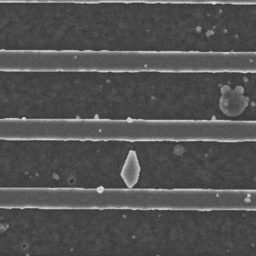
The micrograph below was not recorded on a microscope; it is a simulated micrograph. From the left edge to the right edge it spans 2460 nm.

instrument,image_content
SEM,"lines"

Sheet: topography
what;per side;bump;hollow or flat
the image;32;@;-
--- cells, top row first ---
--------------------------------
--------------------------------
--------------------------------
--------------------------------
--------------------------------
--------------------------------
@@@@@@@@@@@@@@@@@@@@@@@@@-------
@@@@@@@@@@@@@@@@@@@@@@@@@@@@@@@@
@@@@@@@@@@@@@@@@@@@@@@@@@@@@@@@@
--------------------------------
--------------------------------
--------------------------------
--------------------------------
--------------------------------
--------------------------------
@@@@@@@@@@@@@@@@@@@@@@@@@@@@@@@@
@@@@@@@@@@@@@@@@@@@@@@@@@@@@@@@@
----------@@@@-@@@@@@@@@@@@@@@@@
--------------------------------
--------------------------------
--------------------------------
--------------------------------
--------------------------------
------------@-------------------
@@@@@@@@@@@@@@@@@@@@@@@@@@@@@@@@
@@@@@@@@@@@@@@@@@@@@@@@@@@@@@@@@
--------------------------------
--------------------------------
--------------------------------
--------------------------------
--------------------------------
--------------------------------